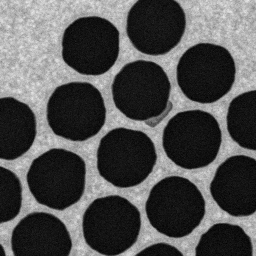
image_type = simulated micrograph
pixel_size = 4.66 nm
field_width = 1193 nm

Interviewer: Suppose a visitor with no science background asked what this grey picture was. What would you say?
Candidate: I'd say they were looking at a regular array of holes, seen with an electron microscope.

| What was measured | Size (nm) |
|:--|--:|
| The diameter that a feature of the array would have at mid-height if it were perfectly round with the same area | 278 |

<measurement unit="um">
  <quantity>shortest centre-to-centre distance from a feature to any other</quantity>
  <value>0.315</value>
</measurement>